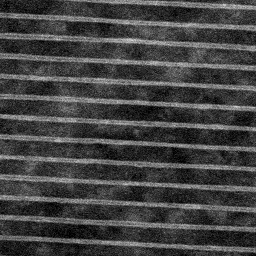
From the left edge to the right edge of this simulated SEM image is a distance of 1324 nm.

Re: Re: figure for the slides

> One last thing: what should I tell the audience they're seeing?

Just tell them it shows parallel lines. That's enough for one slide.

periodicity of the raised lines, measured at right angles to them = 104 nanometers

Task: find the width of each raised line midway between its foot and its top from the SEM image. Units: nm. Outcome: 20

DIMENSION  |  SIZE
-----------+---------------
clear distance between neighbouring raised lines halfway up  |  85.2 nanometres